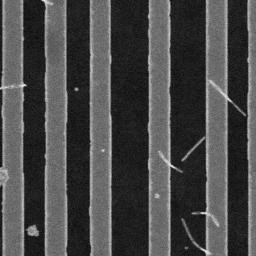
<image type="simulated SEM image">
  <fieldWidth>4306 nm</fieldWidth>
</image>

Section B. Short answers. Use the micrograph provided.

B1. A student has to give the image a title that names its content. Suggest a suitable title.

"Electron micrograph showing lines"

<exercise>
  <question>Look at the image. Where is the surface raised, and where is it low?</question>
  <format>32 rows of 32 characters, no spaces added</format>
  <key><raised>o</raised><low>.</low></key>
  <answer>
ooo...oo...ooo.....oo.....oo...o
ooo...oo...ooo.....oo.....oo...o
ooo...oo...ooo.....oo.....oo...o
ooo...oo...ooo.....oo.....oo...o
ooo...oo...ooo.....oo.....oo...o
ooo...oo...ooo.....oo.....oo...o
ooo...oo...ooo.....oo.....oo...o
ooo...oo...ooo.....oo.....oo...o
ooo...oo...ooo.....oo.....oo...o
ooo...oo...ooo.....oo.....oo...o
ooo...oo...ooo.....oo.....oo...o
ooo...oo...ooo.....oo.....oo...o
ooo...oo...ooo.....oo.....oo...o
ooo...oo...ooo.....oo.....oo...o
ooo...oo...ooo.....oo.....oo...o
ooo...oo...ooo.....oo.....oo...o
ooo...oo...ooo.....oo.....oo...o
ooo...oo...ooo.....oo.....oo...o
ooo...oo...ooo.....oo.....oo...o
ooo...oo...ooo.....oo.....oo...o
ooo...oo...ooo.....oo.....oo...o
ooo...oo...ooo.....oo.....oo...o
ooo...oo...ooo.....oo.....oo...o
ooo...oo...ooo.....oo.....oo...o
ooo...oo...ooo.....oo.....oo...o
ooo...oo...ooo.....oo.....oo...o
ooo...oo...ooo.....oo.....oo...o
ooo...oo...ooo.....oo.....oo...o
ooo...oo...ooo.....oo.....oo...o
ooo...oo...ooo.....oo.....oo...o
ooo...oo...ooo.....oo.....oo...o
ooo...oo...ooo.....oo.....oo...o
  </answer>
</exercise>